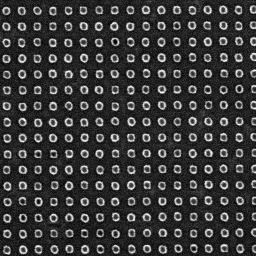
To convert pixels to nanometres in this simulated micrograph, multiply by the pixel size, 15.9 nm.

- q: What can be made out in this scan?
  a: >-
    a regular array of raised bodies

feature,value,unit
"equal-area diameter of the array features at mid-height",115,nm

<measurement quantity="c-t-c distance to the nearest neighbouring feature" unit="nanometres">241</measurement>